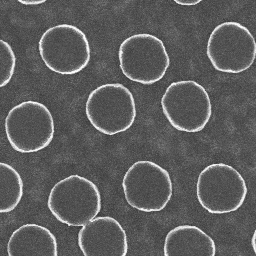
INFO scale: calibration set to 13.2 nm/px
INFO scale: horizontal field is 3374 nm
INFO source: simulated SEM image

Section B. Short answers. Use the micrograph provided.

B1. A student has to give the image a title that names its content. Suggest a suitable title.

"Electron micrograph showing raised bodies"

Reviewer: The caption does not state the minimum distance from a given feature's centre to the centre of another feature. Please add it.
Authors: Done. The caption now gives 966 nm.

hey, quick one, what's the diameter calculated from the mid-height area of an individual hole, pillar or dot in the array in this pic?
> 49 pixels